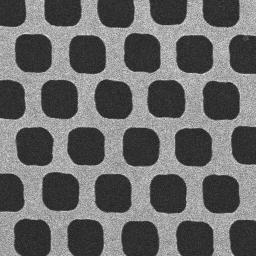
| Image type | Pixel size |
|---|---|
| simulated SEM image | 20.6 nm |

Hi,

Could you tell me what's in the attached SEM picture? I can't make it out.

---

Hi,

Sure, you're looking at a regular array of holes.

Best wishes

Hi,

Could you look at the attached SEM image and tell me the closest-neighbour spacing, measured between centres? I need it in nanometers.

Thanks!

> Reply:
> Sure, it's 1080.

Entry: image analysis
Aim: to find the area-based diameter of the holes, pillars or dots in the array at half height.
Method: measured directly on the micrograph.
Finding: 830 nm